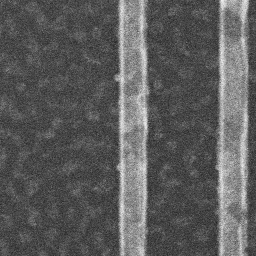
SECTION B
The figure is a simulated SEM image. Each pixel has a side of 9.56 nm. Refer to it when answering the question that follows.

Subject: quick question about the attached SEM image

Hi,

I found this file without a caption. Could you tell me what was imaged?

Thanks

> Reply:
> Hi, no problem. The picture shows one or a few lines or trenches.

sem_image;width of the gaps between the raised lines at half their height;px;78.4